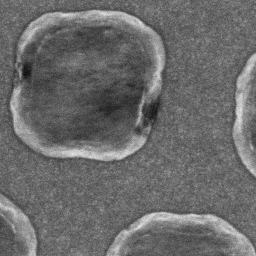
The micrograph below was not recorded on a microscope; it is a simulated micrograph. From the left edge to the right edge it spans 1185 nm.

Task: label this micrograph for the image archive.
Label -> raised bodies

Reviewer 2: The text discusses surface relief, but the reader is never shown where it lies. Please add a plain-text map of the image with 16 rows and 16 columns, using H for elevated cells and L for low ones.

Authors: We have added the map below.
LLLLLLLLLLLLLLLL
LLLHHHHHLLLLLLLL
LLHHHHHHHHLLLLLL
LHHHHHHHHHLLLLLL
LHHHHHHHHHLLLLLH
LHHHHHHHHHLLLLLH
LHHHHHHHHLLLLLLH
LHHHHHHHHLLLLLLH
LLHHHHHHHLLLLLLH
LLLLHHHHLLLLLLLH
LLLLLLLLLLLLLLLL
LLLLLLLLLLLLLLLL
LLLLLLLLLLLLLLLL
HLLLLLLLLLLLLLLL
HHLLLLLLHHHHHHLL
HHLLLLLHHHHHHHHL